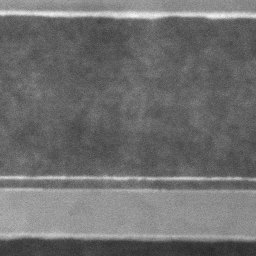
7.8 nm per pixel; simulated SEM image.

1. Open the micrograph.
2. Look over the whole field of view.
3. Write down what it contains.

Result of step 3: lines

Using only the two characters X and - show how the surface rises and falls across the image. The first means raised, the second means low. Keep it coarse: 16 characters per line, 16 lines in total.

XXXXXXXXXXXXXXXX
----------------
----------------
----------------
----------------
----------------
----------------
----------------
----------------
----------------
----------------
XXXXXXXXXXXXXXXX
XXXXXXXXXXXXXXXX
XXXXXXXXXXXXXXXX
XXXXXXXXXXXXXXXX
----------------